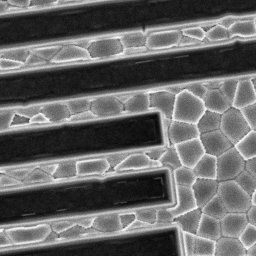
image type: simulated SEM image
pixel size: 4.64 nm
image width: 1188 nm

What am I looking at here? parallel lines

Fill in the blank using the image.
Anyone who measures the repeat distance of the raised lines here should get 58.4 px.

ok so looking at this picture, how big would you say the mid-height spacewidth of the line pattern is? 146 nm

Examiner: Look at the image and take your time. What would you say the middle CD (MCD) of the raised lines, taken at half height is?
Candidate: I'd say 125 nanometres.